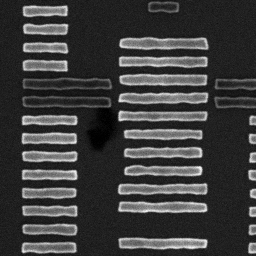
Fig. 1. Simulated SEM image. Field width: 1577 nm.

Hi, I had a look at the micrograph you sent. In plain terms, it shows wiring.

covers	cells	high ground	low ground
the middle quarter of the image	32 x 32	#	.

#............................###
#...............................
................................
..............##################
############..##################
############....................
................................
...............###..###.######.#
###########...##################
############....#############..#
############....................
................................
..............##################
###...........##################
###.............................
................................
................................
...............#################
###..............##############.
###.............................
................................
................################
###............#################
###.............................
................................
................................
...............#################
###.............###...##########
###.............................
................................
..............##################
###...........##################